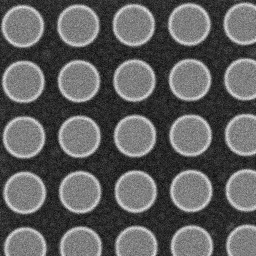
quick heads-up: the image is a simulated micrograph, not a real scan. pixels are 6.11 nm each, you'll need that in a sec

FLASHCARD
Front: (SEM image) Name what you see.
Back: an array of small figures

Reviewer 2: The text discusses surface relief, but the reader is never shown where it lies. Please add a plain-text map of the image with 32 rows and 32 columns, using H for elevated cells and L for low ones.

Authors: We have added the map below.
LLLLLLLLLLLLLLLLLLLLLLLLLLLLLLHL
LHHHHLLLHHHHLLLHHHHLLLHHHHLLLHHH
HHHHHLLHHHHHLLHHHHHLLHHHHHLLHHHH
HHHHHLLHHHHHLLHHHHHLLHHHHHLLHHHH
LHHHHLLLHHHHLLLHHHHLLLHHHHLLLHHH
LLHHLLLLLHHLLLLLHHLLLLLHLLLLLLHL
LLLLLLLLLLLLLLLLLLLLLLLLLLLLLLLL
LLLLLLLLLLLLLLLLLLLLLLLLLLLLLLHL
LHHHHLLLHHHHLLLHHHHLLLHHHHLLLHHH
LHHHHLLHHHHHLLHHHHHLLHHHHHLLHHHH
HHHHHLLHHHHHLLHHHHHLLHHHHHLLHHHH
LHHHHLLLHHHHLLLHHHHLLLHHHHLLLHHH
LLHHLLLLLHHLLLLLHHLLLLLLLLLLLLLL
LLLLLLLLLLLLLLLLLLLLLLLLLLLLLLLL
LLLLLLLLLLLLLLLLLLLLLLLHHLLLLLHH
LHHHHLLLHHHHLLLHHHHLLLHHHHLLLHHH
HHHHHLLHHHHHLLHHHHHLLHHHHHLLHHHH
HHHHHHLHHHHHLLHHHHHLLHHHHHLLHHHH
LHHHHLLLHHHHLLLHHHHLLLHHHHLLLHHH
LLHHLLLLLHHLLLLLHHLLLLLLLLLLLLLL
LLLLLLLLLLLLLLLLLLLLLLLLLLLLLLLL
LLLLLLLLLHHLLLLLHHLLLLLHHLLLLLHH
LHHHHLLLHHHHLLLHHHHLLLHHHHLLLHHH
LHHHHHLLHHHHLLHHHHHLLHHHHHLLHHHH
LHHHHHLLHHHHLLLHHHHLLHHHHHLLHHHH
LHHHHLLLHHHHLLLHHHHLLLHHHHLLLHHH
LLHHLLLLLHHLLLLLLLLLLLLLLLLLLLLL
LLLLLLLLLLLLLLLLLLLLLLLLLLLLLLLL
LLLLLLLLLHHLLLLLHHLLLLLHHLLLLLHH
LHHHHLLLHHHHLLLHHHHLLLHHHHLLLHHH
LHHHHHLLHHHHHLLHHHHHLHHHHHLLHHHH
LHHHHHLLHHHHHLLHHHHHLLHHHHHLLHHH